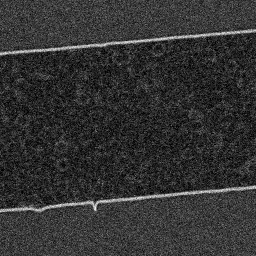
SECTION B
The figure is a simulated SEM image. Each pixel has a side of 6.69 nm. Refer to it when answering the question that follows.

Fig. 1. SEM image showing one or a few lines or trenches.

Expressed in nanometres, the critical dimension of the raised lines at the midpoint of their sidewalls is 1050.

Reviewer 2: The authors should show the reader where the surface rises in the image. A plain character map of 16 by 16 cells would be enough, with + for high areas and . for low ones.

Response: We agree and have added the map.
................
................
.........+++++++
++++++++++++++++
++++++++++++++++
++++++++++++++++
++++++++++++++++
++++++++++++++++
++++++++++++++++
++++++++++++++++
++++++++++++++++
++++++++++++++++
++++++++........
................
................
................